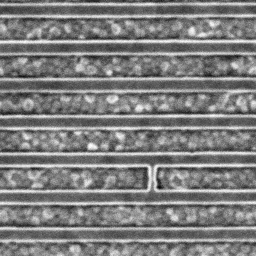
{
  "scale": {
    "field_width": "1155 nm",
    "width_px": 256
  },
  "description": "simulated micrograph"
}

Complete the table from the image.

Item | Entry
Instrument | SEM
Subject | parallel lines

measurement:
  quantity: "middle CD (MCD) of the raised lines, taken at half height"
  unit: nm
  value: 57.5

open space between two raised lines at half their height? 110 nm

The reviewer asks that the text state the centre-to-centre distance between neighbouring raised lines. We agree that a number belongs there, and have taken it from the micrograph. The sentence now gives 169 nm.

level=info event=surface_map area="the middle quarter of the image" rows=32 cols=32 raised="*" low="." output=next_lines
................................
................................
................................
................................
********************************
********************************
********************************
................................
................................
................................
................................
................................
................................
********************************
********************************
********************************
................................
................................
................................
................................
................................
................................
********************************
********************************
********************************
.....................**.........
......................*.........
......................*.........
......................*.........
......................*.........
.....................**.........
.....................**.........